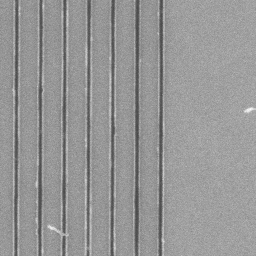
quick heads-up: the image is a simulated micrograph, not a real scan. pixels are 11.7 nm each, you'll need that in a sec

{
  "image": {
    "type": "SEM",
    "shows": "parallel lines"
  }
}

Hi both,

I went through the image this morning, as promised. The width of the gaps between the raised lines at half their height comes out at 19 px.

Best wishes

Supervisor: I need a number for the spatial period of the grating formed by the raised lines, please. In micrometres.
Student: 0.281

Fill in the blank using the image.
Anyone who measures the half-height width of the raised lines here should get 5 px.